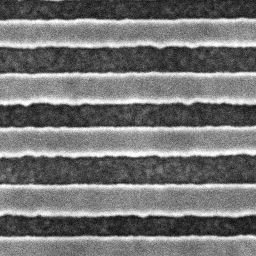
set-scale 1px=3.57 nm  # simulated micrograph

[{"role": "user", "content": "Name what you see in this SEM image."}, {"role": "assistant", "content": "lines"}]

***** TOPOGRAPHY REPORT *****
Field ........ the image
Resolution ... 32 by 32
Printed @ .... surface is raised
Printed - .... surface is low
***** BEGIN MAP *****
--------------------------------
--------------------------------
---------@@@---@@-@---@@@@@@@@@@
@@@@@@@@@@@@@@@@@@@@@@@@@@@@@@@@
@@@@@@@@@@@@@@@@@@@@@@@@@@@@@@@@
@@@@@@@@@@@@@@@@@@@@@@@@@@@@@@@@
--------------------------------
--------------------------------
--------------------------------
@@@@@@@@@@@@@@@@@@@@@@@@@@@@@@@@
@@@@@@@@@@@@@@@@@@@@@@@@@@@@@@@@
@@@@@@@@@@@@@@@@@@@@@@@@@@@@@@@@
@@@@@@@@@@@@@@@@@@@@@@@@@@@@@@@@
--------------------------------
--------------------------------
--------------------------------
@@@@@@@@@@@@@@@@@@@@@@@@@@@@@@@@
@@@@@@@@@@@@@@@@@@@@@@@@@@@@@@@@
@@@@@@@@@@@@@@@@@@@@@@@@@@@@@@@@
@@@-@-@-@@@@@-@-@@--@@-@--@-----
--------------------------------
--------------------------------
--------------------------------
@@@@@@@@@@@@@@@@@@@@@@@@@@@@@@@@
@@@@@@@@@@@@@@@@@@@@@@@@@@@@@@@@
@@@@@@@@@@@@@@@@@@@@@@@@@@@@@@@@
@@@@@@@@@@@@@@@@@@@@@@@@@@@@@@@@
--------------------------------
--------------------------------
------------------------------@@
@@@@@@@@@@@@@@@@@@@@@@@@@@@@@@@@
@@@@@@@@@@@@@@@@@@@@@@@@@@@@@@@@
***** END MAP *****